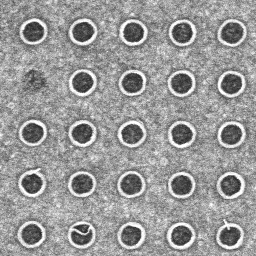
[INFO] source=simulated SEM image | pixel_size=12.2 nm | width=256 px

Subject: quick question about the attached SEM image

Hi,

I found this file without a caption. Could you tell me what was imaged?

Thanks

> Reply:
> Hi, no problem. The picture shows a regular array of raised bodies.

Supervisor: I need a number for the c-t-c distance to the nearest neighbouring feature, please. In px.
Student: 49.5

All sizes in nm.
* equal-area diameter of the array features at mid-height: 309